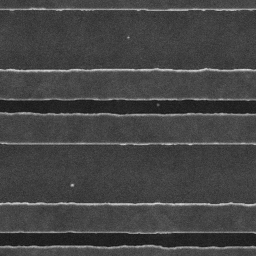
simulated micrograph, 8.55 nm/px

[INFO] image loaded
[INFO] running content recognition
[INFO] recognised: lines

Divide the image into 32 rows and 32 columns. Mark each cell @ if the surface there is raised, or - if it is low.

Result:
@@@@@@@@@@@@@@@@@@@@@@@@@@@@@@@@
--------------------------------
--------------------------------
--------------------------------
--------------------------------
--------------------------------
--------------------------------
--------------------------------
--------------------------------
@@@@@@@@@@@@@@@@@@@@@@@@@@@@@@@@
@@@@@@@@@@@@@@@@@@@@@@@@@@@@@@@@
@@@@@@@@@@@@@@@@@@@@@@@@@@@@@@@@
-------------------------------@
--------------------------------
@@@@@@@@@@@@@@@@@@@@@@@@@@@@@@@@
@@@@@@@@@@@@@@@@@@@@@@@@@@@@@@@@
@@@@@@@@@@@@@@@@@@@@@@@@@@@@@@@@
@@@@@@@@@@@@@@@@@@@@@@@@@@@@@@@@
--------------------------------
--------------------------------
--------------------------------
--------------------------------
--------------------------------
--------------------------------
--------------------------------
@@@@@@@@@@@@@@@@@@@@@@@@@@@@@@@@
@@@@@@@@@@@@@@@@@@@@@@@@@@@@@@@@
@@@@@@@@@@@@@@@@@@@@@@@@@@@@@@@@
@@@@@@@@@@@@@@@@@@@@@@@@@@@@@@@@
--------------------------------
--------------------------------
@@@@@@@@@@@@@@@@@@@@@@@@@@@@@@@@